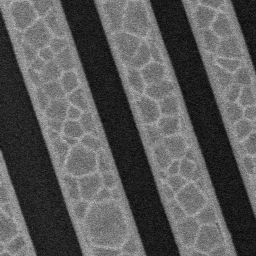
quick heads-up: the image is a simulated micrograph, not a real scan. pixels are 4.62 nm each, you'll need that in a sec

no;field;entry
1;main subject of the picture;one or a few lines or trenches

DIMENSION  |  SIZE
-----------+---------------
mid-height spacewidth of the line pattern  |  183 nanometres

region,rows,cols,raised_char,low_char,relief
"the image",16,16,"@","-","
@@@@--@@@---@@--
-@@@---@@@--@@@-
-@@@---@@@--@@@-
-@@@@--@@@---@@-
--@@@---@@@--@@@
--@@@---@@@--@@@
--@@@@--@@@---@@
---@@@---@@@--@@
---@@@---@@@--@@
---@@@@--@@@---@
----@@@---@@@--@
----@@@---@@@---
@---@@@@--@@@---
@----@@@---@@@--
@@---@@@---@@@--
@@---@@@@--@@@--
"